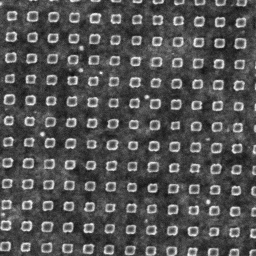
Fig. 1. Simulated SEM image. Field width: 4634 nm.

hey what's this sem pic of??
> a regular array of raised bodies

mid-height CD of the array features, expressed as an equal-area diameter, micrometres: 0.179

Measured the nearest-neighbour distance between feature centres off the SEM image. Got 370 nm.